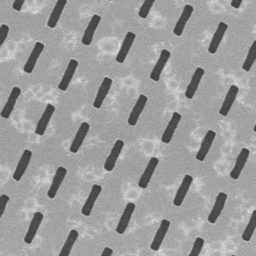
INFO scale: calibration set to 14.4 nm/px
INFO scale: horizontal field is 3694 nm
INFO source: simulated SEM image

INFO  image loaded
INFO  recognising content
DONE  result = a regular array of holes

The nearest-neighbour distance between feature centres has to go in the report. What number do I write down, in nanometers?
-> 558